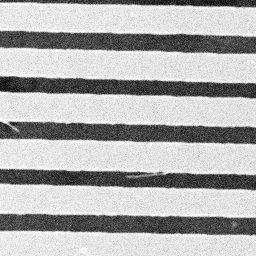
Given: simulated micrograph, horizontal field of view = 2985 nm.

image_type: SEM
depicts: lines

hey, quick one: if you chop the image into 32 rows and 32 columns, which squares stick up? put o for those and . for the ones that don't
ooooo...........................
oooooooooooooooooooooooooooooooo
oooooooooooooooooooooooooooooooo
oooooooooooooooooooooooooooooooo
................................
................................
ooooooooooooooooooooo...........
oooooooooooooooooooooooooooooooo
oooooooooooooooooooooooooooooooo
..oooooooooooooooooooooooooooooo
................................
................................
oooooooooooooooooooooooooooooooo
oooooooooooooooooooooooooooooooo
oooooooooooooooooooooooooooooooo
....................oooooooooooo
................................
oooooo..........................
oooooooooooooooooooooooooooooooo
oooooooooooooooooooooooooooooooo
oooooooooooooooooooooooooooooooo
..................oooooooooooooo
................................
oooooooooooooooo................
oooooooooooooooooooooooooooooooo
oooooooooooooooooooooooooooooooo
oooooooooooooooooooooooooooooooo
................................
................................
oooooooooooooooooooooooooooooooo
oooooooooooooooooooooooooooooooo
oooooooooooooooooooooooooooooooo